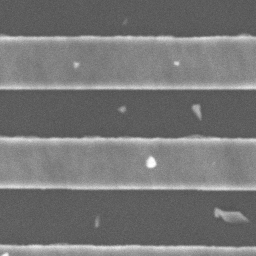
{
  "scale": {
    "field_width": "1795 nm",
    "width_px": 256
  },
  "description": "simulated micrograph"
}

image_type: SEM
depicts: lines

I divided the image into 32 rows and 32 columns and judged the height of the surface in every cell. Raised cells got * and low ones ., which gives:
................................
................................
................................
................................
................................
********************************
********************************
********************************
********************************
********************************
********************************
................................
................................
................................
................................
................................
................................
********************************
********************************
********************************
********************************
********************************
********************************
.....*..************************
................................
................................
................................
................................
................................
................................
................................
********************************